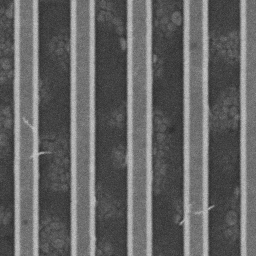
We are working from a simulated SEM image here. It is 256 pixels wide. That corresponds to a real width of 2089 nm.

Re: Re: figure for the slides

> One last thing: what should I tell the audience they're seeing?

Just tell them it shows parallel lines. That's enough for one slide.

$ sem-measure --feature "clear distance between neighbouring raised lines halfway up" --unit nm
312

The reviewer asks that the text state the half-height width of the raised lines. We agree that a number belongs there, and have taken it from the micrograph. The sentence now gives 18.6 pixels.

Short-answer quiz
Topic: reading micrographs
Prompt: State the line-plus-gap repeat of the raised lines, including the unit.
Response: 461 nm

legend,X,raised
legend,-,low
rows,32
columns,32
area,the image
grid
--XX-----XX-----XXX----XXX-----X
--XX-----XX-----XXX----XXX-----X
--XX-----XX-----XXX----XXX-----X
--XX-----XX-----XXX----XXX-----X
--XX-----XX-----XXX----XXX-----X
--XX-----XX-----XXX----XXX-----X
--XX-----XX-----XXX----XXX-----X
--XX-----XXX----XXX----XXX----XX
--XX-----XXX----XXX----XXX----XX
--XX-----XXX----XXX----XXX----XX
--XX-----XXX----XXX----XXX----XX
--XX-----XXX----XXX----XXX----XX
--XX-----XXX----XXX----XXX----XX
--XX-----XXX----XXX----XXX----XX
--XX-----XXX----XXX----XXX----XX
--XX-----XXX----XXX----XXX----XX
--XX-----XXX----XXX----XXX----XX
--XX-----XXX----XXX----XXX----XX
--XX-----XXX----XXX----XXX----XX
--XXX----XXX----XXX----XXX----XX
--XX-----XXX----XXX----XXX----XX
--XXX----XXX----XXX----XXX----XX
--XXX----XXX----XXX----XXX----XX
--XX-----XX-----XXX----XXX-----X
--XX-----XXX----XXX----XXX-----X
--XX-----XXX----XXX----XXX-----X
--XX-----XXX----XXX----XXX----XX
--XX-----XXX----XXX----XXX----XX
--XX-----XXX----XXX----XXX----XX
--XX-----XXX----XXX----XXX----XX
--XX-----XXX----XXX----XXX----XX
--XX-----XXX----XXX----XXX-----X